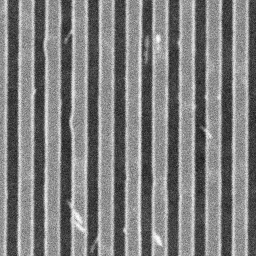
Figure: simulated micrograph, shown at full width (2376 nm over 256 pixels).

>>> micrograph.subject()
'parallel lines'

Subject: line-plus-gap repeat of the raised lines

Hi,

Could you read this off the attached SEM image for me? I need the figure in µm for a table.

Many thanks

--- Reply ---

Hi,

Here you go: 0.248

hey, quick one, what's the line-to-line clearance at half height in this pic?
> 116 nm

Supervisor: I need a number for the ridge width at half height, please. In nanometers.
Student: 132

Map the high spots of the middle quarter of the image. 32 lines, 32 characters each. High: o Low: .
..oooo...ooo....ooo...oooo...ooo
..oooo...ooo....ooo...oooo...ooo
..oooo...ooo....ooo...oooo...ooo
..oooo...ooo....ooo...oooo...ooo
..oooo...ooo....ooo...oooo...ooo
..oooo...ooo....ooo...oooo...ooo
..oooo...ooo....ooo...oooo...ooo
..oooo...ooo....ooo...oooo...ooo
..oooo...ooo....ooo...oooo...ooo
..oooo...ooo....ooo...oooo...ooo
..oooo...ooo....ooo...oooo...ooo
..oooo...ooo....ooo...oooo...ooo
..oooo...ooo....ooo...oooo...ooo
..oooo...ooo....ooo...oooo...ooo
..oooo...ooo....ooo...oooo...ooo
..oooo...ooo....ooo...oooo...ooo
..oooo...ooo....ooo...oooo...ooo
..oooo...ooo....ooo...oooo...ooo
..oooo...ooo....ooo...oooo...ooo
..oooo...ooo....ooo...oooo...ooo
..oooo...ooo....ooo...oooo...ooo
..oooo...ooo....ooo...oooo...ooo
..oooo...ooo....ooo...oooo...ooo
..oooo...ooo....ooo...oooo...ooo
..oooo...ooo....ooo...oooo...ooo
..oooo...ooo....ooo...oooo...ooo
..ooo....ooo....ooo...oooo...ooo
..oooo...ooo....ooo...oooo...ooo
..oooo...ooo....ooo....oo....ooo
..oooo...ooo....ooo....oo....ooo
..oooo...ooo....ooo...ooo....ooo
..oooo...ooo....ooo...oooo...ooo